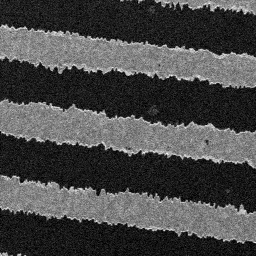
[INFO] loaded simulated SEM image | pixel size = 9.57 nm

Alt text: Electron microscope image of one or a few lines or trenches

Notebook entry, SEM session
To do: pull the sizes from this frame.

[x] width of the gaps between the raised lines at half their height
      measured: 0.42 microns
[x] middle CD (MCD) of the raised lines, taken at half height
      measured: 296 nanometers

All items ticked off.